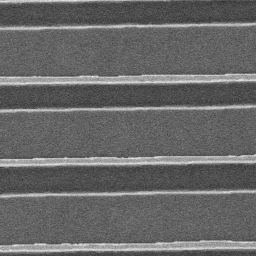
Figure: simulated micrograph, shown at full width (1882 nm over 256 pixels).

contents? lines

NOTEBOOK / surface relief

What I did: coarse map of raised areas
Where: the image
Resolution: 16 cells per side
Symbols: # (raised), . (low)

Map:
................
...............#
################
################
################
................
................
################
################
################
................
................
################
################
################
#############...